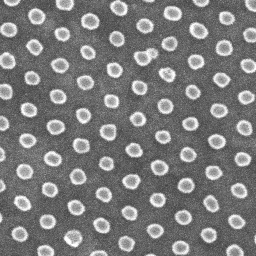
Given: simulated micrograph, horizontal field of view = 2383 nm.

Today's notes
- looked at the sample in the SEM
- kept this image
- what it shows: a regular array of raised bodies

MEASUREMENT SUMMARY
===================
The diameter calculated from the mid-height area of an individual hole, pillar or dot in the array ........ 130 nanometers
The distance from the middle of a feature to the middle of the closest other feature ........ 284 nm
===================